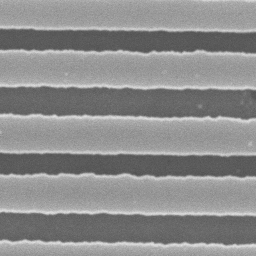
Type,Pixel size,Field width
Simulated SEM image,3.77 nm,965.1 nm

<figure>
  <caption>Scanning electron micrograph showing lines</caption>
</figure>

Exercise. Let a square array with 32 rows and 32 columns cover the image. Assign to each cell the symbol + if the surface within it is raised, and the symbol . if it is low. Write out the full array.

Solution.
++++++++++++++++++++++++++++++++
++++++++++++++++++++++++++++++++
++++++++++++++++++++++++++++++++
++++++++++++++++++++++++++++++++
................................
................................
+++++++++++++++++..+++.++++++...
++++++++++++++++++++++++++++++++
++++++++++++++++++++++++++++++++
++++++++++++++++++++++++++++++++
++++++++++++++++++++++++++++++++
................................
................................
................................
+++++++..++.....................
++++++++++++++++++++++++++++++++
++++++++++++++++++++++++++++++++
++++++++++++++++++++++++++++++++
++++++++++++++++++++++++++++++++
............................+...
................................
................................
++++++++++++++++++++++++++++++++
++++++++++++++++++++++++++++++++
++++++++++++++++++++++++++++++++
++++++++++++++++++++++++++++++++
.+++++++++++++++++++++++++++++++
................................
................................
................................
++++++++++++++++++++.+++++++....
++++++++++++++++++++++++++++++++